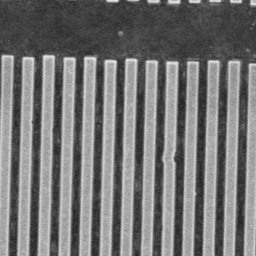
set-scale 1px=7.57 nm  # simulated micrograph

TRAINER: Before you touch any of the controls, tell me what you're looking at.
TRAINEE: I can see parallel lines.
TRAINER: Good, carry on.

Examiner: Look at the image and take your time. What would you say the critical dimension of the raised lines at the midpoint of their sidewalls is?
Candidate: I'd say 82.3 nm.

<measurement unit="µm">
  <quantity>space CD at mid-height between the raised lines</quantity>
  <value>0.0756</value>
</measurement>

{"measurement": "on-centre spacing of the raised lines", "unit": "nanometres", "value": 156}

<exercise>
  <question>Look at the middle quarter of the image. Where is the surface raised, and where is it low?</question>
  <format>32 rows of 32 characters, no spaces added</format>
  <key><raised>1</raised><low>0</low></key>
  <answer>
11100111001110001100011000110001
11100111001110001100011000110001
11000111001110001100011000110001
11000111001110011100011000110001
11000111001110011100011000110001
11000111001110011100011000110001
11000111001110011100111000110001
11000111001110011100111000110001
11000111001110011100111000110001
11000111001110011100111000110001
11000111001110011100111000110001
11000110001110011100011000110001
11000110001110011100111000110001
11000110001100011100111000110001
11000110001100011100111001110001
11000110001100011100111001110011
11000110001100011100111001110011
11000110001100011100111001110011
11000110001100011100111001110011
11000110001100011100111001110011
11000110001100011100111001110011
11000110001100011100111001110011
11000110001100011000111001110011
11000110001100011000110001100011
11000110001100011000110001110011
11000110001100011000110001110011
11000110001100011000110001110011
11000110001100011000110001110011
11000110001100011000110001110011
11000110001100011000110001110011
11001110001100011000110001110011
11001110011100011000110001110011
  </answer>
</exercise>